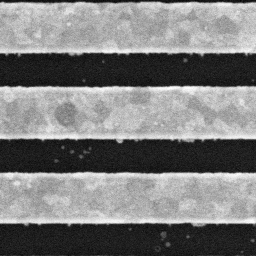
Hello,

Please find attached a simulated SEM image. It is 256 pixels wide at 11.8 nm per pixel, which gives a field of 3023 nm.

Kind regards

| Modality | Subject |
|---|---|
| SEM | lines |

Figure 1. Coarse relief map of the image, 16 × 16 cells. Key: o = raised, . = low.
oooooooooooooooo
oooooooooooooooo
oooooooooooooooo
................
................
................
oooooooooooooooo
oooooooooooooooo
oooooooooooooooo
................
................
oooooooooooooooo
oooooooooooooooo
oooooooooooooooo
................
................